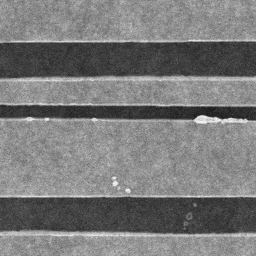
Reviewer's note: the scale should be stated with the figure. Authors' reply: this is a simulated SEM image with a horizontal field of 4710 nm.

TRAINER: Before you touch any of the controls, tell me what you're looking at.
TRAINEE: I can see lines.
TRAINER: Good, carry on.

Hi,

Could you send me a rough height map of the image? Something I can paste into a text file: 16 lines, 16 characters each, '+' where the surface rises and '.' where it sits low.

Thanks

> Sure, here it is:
++++++++++++++++
++++++++++++++++
++++++++++++++++
................
................
++++++++++++++++
++++++++++++++++
++++++++++++++++
++++++++++++++++
++++++++++++++++
++++++++++++++++
++++++++++++++++
................
................
................
++++++++++++++++